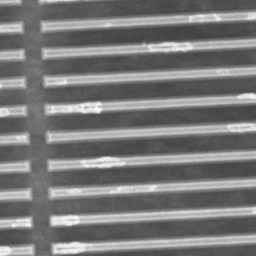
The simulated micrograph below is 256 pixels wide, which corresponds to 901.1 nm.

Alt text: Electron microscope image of parallel lines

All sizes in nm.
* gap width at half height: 65.8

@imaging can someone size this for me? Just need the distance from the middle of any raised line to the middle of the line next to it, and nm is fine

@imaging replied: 97.8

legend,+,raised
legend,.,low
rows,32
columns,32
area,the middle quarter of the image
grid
................................
...............................+
...........+++++++++++++++++++++
++++++++++++++++++++++++++++++++
++++++++++++++..................
................................
................................
................................
...............................+
........+...++++++++++++++++++++
++++++++++++++++++++++++++++++++
++++++++++++++..................
................................
................................
................................
................................
............++++++++++++++++++++
++++++++++++++++++++++++++++++++
+++++++++++++++.................
................................
................................
................................
................................
.........+++++++++++++++++++++++
++++++++++++++++++++++++++++++++
+++++++++++++++.................
................................
................................
................................
................................
.............+++++++++++++++++++
++++++++++++++++++++++++++++++++